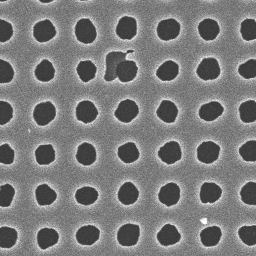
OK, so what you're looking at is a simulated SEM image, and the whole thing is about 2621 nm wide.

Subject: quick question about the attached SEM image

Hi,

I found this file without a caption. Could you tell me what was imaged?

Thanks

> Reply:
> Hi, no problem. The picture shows a regular array of holes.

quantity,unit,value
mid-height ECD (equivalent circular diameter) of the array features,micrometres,0.223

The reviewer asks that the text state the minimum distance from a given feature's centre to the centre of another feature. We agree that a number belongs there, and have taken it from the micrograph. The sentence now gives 0.412 µm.